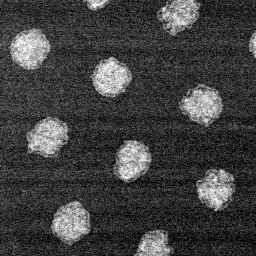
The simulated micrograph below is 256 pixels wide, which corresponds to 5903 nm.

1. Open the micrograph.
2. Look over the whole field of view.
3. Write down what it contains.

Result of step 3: holes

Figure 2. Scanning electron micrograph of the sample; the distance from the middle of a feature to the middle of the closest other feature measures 1980 nm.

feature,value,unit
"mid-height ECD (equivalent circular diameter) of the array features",0.815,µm